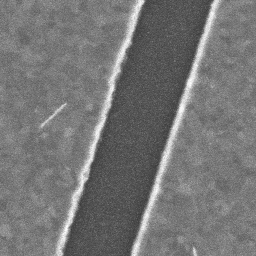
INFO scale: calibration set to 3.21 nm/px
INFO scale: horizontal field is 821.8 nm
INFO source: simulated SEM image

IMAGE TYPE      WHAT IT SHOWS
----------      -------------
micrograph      one or a few lines or trenches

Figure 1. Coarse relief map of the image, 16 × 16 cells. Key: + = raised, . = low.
+++++++++....+++
++++++++.....+++
++++++++.....+++
++++++++....++++
+++++++.....++++
+++++++.....++++
+++++++....+++++
++++++.....+++++
++++++.....+++++
++++++....++++++
+++++.....++++++
+++++.....++++++
+++++....+++++++
++++.....+++++++
++++.....+++++++
++++.....+++++++